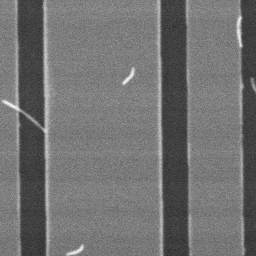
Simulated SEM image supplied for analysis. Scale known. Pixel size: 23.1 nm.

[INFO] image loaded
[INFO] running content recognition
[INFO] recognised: lines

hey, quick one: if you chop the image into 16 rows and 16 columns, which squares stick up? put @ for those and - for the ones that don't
@--@@@@@@@--@@@-
@--@@@@@@@--@@@-
@--@@@@@@@--@@@-
@--@@@@@@@--@@@-
@--@@@@@@@--@@@-
@--@@@@@@@--@@@-
@--@@@@@@@--@@@-
@--@@@@@@@--@@@-
@--@@@@@@@--@@@-
@--@@@@@@@--@@@-
@--@@@@@@@--@@@-
@--@@@@@@@--@@@-
@--@@@@@@@--@@@-
@--@@@@@@@--@@@-
@--@@@@@@@--@@@-
@--@@@@@@@--@@@-